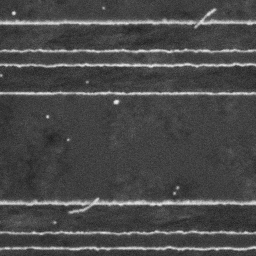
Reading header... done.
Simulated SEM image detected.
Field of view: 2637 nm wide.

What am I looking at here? lines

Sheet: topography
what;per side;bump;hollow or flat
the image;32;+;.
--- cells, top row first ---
++++++++++++++++++++++++++++++++
++++++++++++++++++++++++++++++++
++++++++++++++++++++++++++++++++
................................
................................
................................
++++++++++++++++++++++++++++++++
++++++++++++++++++++++++++++++++
................................
................................
................................
................................
++++++++++++++++++++++++++++++++
++++++++++++++++++++++++++++++++
++++++++++++++++++++++++++++++++
++++++++++++++++++++++++++++++++
++++++++++++++++++++++++++++++++
++++++++++++++++++++++++++++++++
++++++++++++++++++++++++++++++++
++++++++++++++++++++++++++++++++
++++++++++++++++++++++++++++++++
++++++++++++++++++++++++++++++++
++++++++++++++++++++++++++++++++
++++++++++++++++++++++++++++++++
++++++++++++++++++++++++++++++++
.+++++.++++++++++.+++++.+++..+++
................................
................................
................................
++++++++++++++++++++++++++++++++
++++++++++++++++++++++++++++++++
................................